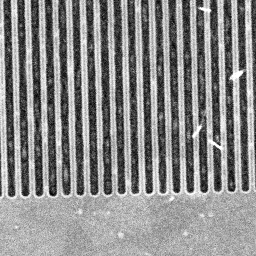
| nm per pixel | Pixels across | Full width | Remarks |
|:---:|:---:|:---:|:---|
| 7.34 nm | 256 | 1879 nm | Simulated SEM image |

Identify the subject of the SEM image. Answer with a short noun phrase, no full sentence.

parallel lines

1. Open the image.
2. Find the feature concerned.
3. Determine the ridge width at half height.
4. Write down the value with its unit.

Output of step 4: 37.6 nanometres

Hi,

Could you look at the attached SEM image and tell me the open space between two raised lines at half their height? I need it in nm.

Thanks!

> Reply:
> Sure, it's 63.3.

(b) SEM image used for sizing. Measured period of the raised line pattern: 101 nanometers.